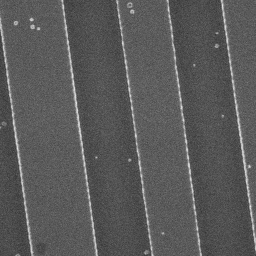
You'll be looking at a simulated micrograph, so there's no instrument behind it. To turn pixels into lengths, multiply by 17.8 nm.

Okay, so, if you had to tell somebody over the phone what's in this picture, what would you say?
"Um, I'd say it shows lines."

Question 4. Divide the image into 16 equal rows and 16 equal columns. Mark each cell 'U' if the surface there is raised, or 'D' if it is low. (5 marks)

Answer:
UUUUDDDUUUUDDDUU
UUUUDDDUUUUDDDUU
UUUUDDDDUUUDDDUU
UUUUDDDDUUUDDDUU
UUUUUDDDUUUDDDUU
DUUUUDDDUUUDDDDU
DUUUUDDDUUUDDDDU
DUUUUDDDUUUDDDDU
DUUUUDDDUUUUDDDU
DUUUUDDDDUUUDDDU
DUUUUDDDDUUUDDDU
DUUUUDDDDUUUDDDU
DUUUUUDDDUUUDDDD
DDUUUUDDDUUUDDDD
DDUUUUDDDUUUDDDD
DDUUUUDDDUUUUDDD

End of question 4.